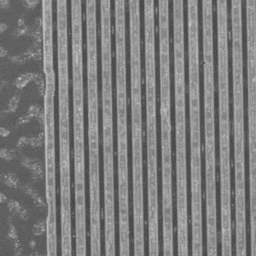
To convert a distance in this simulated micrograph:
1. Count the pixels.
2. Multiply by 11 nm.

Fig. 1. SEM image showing parallel lines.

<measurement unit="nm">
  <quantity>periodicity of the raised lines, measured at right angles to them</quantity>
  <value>160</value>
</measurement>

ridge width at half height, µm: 0.0839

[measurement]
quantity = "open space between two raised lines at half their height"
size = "0.0742 micrometres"